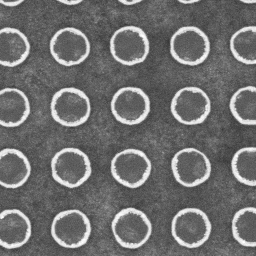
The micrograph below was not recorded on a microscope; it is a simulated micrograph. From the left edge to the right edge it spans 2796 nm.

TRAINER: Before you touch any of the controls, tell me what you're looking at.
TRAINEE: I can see a regular array of raised bodies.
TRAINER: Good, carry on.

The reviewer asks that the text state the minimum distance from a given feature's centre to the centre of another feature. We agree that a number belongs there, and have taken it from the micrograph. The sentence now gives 652 nm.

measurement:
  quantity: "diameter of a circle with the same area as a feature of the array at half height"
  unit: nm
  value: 398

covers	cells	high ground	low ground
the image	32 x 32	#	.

................................
................................
................................
................................
###....###....####....####...###
###...#####...####....####...###
###....####...####....####...###
###....###.....###....###.....##
................................
................................
................................
##.....###.....###....###.....##
###....####...####....####...###
###....####...####....####...###
###....####...####....####...###
##......##......................
................................
................................
................................
###....####....###....###....###
####...####...#####...####...###
####...####...#####...####...###
###....###.....###....###.....##
................................
................................
................................
.#......##.....##......##.....##
###....####...####....####...###
####...####...#####...####...###
####...####...####....####...###
###.....##.....###.....##......#
................................